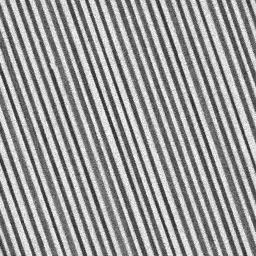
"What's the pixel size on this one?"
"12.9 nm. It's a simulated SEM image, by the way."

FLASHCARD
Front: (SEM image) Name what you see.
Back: parallel lines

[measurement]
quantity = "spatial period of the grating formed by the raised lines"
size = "123 nanometers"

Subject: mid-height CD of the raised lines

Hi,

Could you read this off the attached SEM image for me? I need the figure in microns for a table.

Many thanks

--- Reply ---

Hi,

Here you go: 0.0657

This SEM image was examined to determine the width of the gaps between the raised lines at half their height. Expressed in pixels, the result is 4.37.